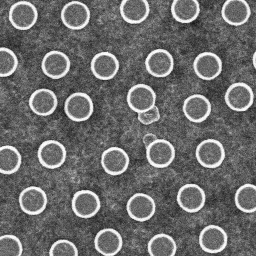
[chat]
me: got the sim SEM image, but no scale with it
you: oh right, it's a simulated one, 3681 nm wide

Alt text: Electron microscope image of a regular array of raised bodies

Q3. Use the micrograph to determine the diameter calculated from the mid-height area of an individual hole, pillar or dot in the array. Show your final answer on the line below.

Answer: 373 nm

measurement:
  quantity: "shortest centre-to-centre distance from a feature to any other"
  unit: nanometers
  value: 663